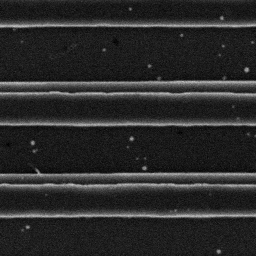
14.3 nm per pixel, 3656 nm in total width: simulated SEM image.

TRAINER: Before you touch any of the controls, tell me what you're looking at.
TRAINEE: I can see lines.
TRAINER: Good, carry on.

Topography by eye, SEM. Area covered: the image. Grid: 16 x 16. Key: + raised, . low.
++++++++++++++++
++++++++++++++++
................
................
................
++++++++++++++++
++++++++++++++++
++++++++++++++++
................
................
................
++++++++++++++++
++++++++++++++++
................
................
................